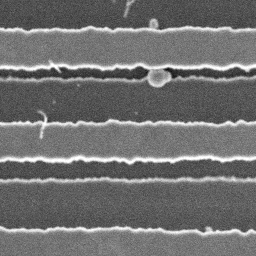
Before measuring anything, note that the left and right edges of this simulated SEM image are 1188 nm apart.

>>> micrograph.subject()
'lines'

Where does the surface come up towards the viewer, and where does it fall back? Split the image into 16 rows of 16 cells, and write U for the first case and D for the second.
DDDDDDDDDDDDDDDD
DDDDDDDDDDDDDDDD
UUUUUUUUUUUUUUUU
UUUUUUUUUUUUUUUU
DDDDDDDDDDDDDDDD
DDDDDDDDDDDDDDDD
DDDDDDDDDDDDDDDD
DDDDDDDDDDDDDDDD
UUUUUUUUUUUUUUUU
UUUUUUUUUUUUUUUU
DDDDDDDDDDDDDDDD
DDDDDDDDDDDDDDDD
DDDDDDDDDDDDDDDD
DDDDDDDDDDDDDDDD
UUUUUUUUUUUUUUUU
UUUUUUUUUUUUUUUU